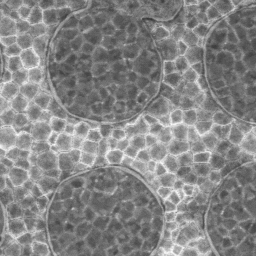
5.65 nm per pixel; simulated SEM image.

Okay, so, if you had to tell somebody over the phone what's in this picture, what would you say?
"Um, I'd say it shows raised bodies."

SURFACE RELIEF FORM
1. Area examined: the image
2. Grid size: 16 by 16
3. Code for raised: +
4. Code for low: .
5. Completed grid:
.....++++++....+
....+++++.....++
...+++++++...+++
...+++++++...+++
...+++++++...+++
...+++++++...+++
....+++++.....++
.....+++.......+
................
................
......++.......+
....+++++.....++
...+++++++...+++
...+++++++...+++
...+++++++...+++
...+++++++...+++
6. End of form